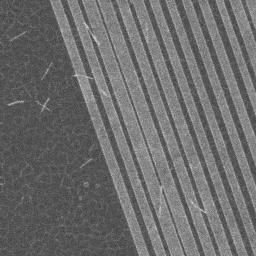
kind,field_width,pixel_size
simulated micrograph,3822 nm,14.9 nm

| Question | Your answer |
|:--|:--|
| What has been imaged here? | parallel lines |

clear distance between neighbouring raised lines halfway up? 89.9 nanometers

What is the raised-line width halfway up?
0.141 micrometres